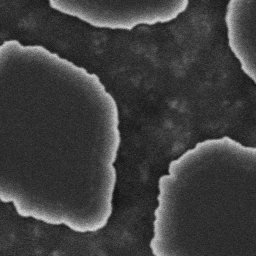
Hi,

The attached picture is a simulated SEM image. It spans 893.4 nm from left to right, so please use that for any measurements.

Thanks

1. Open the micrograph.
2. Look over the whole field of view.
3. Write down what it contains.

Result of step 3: raised bodies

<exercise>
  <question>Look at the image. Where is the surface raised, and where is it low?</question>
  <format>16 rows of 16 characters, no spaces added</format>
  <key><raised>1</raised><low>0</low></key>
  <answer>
0000111111100011
0000001110000011
0000000000000011
1111000000000001
1111100000000001
1111110000000000
1111111000000000
1111111000000000
1111111000000000
1111111000001111
1111111000011111
1111111000111111
1111111000111111
0011111000111111
0000000000111111
0000000000111111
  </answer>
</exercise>